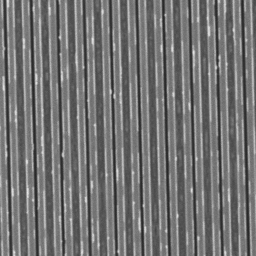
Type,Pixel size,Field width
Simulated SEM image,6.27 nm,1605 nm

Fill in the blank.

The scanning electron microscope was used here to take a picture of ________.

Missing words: parallel lines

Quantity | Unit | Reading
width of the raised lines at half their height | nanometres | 49.4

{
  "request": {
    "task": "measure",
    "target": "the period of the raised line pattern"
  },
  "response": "82.9 nm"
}